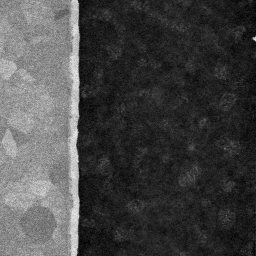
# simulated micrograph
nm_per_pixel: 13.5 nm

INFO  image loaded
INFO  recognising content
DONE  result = one or a few lines or trenches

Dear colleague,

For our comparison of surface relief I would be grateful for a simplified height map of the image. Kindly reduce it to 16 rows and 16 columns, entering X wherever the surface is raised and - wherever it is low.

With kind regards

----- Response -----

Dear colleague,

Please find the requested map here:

XXXXX-----------
XXXXX-----------
XXXXX-----------
XXXXX-----------
XXXXX-----------
XXXXX-----------
XXXXX-----------
XXXXX-----------
XXXXX-----------
XXXXX-----------
XXXXX-----------
XXXXX-----------
XXXXX-----------
XXXXX-----------
XXXXX-----------
XXXXX-----------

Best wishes